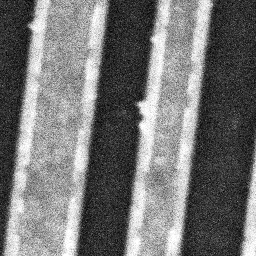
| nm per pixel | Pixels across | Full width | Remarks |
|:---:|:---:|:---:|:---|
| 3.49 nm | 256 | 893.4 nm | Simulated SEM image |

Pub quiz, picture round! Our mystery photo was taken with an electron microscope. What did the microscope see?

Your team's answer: one or a few lines or trenches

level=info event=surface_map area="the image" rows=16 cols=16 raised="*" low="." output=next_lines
..****....***...
..****....***...
..****....***...
..****....***...
..****....**....
..****....**....
..****...***....
..***....***....
..***....***....
.****....***....
.****....***....
.****....**.....
.****....**.....
.****...***.....
.****...***.....
.***....***....*